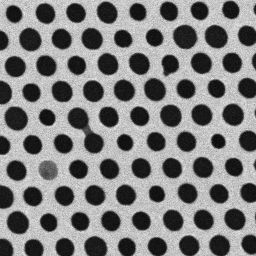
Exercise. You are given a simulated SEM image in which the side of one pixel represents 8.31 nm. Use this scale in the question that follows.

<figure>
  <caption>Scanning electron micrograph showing a regular array of holes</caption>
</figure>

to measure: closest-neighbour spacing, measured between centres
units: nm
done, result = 250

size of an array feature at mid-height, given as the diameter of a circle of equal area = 164 nm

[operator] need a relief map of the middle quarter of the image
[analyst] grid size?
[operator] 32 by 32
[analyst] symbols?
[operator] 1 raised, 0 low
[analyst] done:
10000011000000110000011100000111
10000111100001111000011110001111
11101111110011111100111110011111
11111111111111111111111111111111
11111100011110001111100011111000
00111000011110000111000001110000
00111000001100000011000001110000
00111000001110000011000001111000
00111000011110000111100001111101
11111110111111111111111111111111
11111111111111111111111110001111
11000111100001111000011100000111
10000011100000111000011100000111
10000011100000111000011100000111
10000011100000111000011110000111
11000011110001111111111111001111
11110001111111111111111111111111
11111000111111111111110011111000
00111000011110000111100001110000
00111000001110000111100001110000
00111000001110000111100001110000
00111100011111101111110011111000
11111111111111111111111111111111
11111111111111111111111111011111
11000111110001111000011110000111
10000011100000111000001100000111
10000011100000111000001110000011
11000011100000111000011110000111
11100111111011111110111111101111
11111111111111111111111111111111
01111110111111001111110011111000
00111100001110000111100001111000